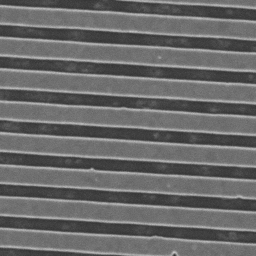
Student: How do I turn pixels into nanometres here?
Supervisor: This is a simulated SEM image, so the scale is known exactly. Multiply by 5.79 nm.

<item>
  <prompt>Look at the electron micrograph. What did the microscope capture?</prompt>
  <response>parallel lines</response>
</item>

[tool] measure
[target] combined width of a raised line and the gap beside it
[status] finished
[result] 0.184 µm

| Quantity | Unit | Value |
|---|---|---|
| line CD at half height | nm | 106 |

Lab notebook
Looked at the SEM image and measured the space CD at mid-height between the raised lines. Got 78 nm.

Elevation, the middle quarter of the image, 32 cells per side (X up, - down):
---------------------------XXXXX
--------------------------------
XX------------------------------
XXXXXXXXXXXXXXXXXX--------------
XXXXXXXXXXXXXXXXXXXXXXXXXXXXXXXX
XXXXXXXXXXXXXXXXXXXXXXXXXXXXXXXX
XXXXXXXXXXXXXXXXXXXXXXXXXXXXXXXX
-----------XXXXXXXXXXXXXXXXXXXXX
----------------------------XXXX
--------------------------------
X-------------------------------
XXXXXXXXXXXXXXXXXX--------------
XXXXXXXXXXXXXXXXXXXXXXXXXXXXXXXX
XXXXXXXXXXXXXXXXXXXXXXXXXXXXXXXX
XXXXXXXXXXXXXXXXXXXXXXXXXXXXXXXX
------------XXXXXXXXXXXXXXXXXXXX
----------------------------XXXX
--------------------------------
XX------------------------------
XXXXXXXXXXXXXXXXXX--------------
XXXXXXXXXXXXXXXXXXXXXXXXXXXXXXXX
XXXXXXXXXXXXXXXXXXXXXXXXXXXXXXXX
XXXXXXXXXXXXXXXXXXXXXXXXXXXXXXXX
------------XXXXXXXXXXXXXXXXXXXX
----------------------------XXXX
--------------------------------
XX------------------------------
XXXXXXXXXXXXXXXXXXX-------------
XXXXXXXXXXXXXXXXXXXXXXXXXXXXXXXX
XXXXXXXXXXXXXXXXXXXXXXXXXXXXXXXX
XXXXXXXXXXXXXXXXXXXXXXXXXXXXXXXX
------------XXXXXXXXXXXXXXXXXXXX